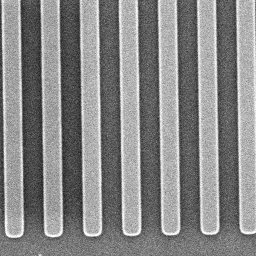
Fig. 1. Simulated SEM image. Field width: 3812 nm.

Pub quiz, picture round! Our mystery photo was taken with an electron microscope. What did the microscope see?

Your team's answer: groups of lines, slits or small figures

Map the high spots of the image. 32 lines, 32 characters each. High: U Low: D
UUDDDUUDDDUUDDDUUDDDUUDDDUUDDDUU
UUDDDUUDDDUUDDDUUDDDUUDDDUUDDDUU
UUUDDUUDDDUUDDDUUDDDUUDDDUUDDDUU
UUUDDUUDDDUUDDDUUDDDUUDDDUUDDDUU
UUUDDUUDDDUUDDDUUDDDUUDDDUUDDDUU
UUUDDUUDDDUUDDDUUDDDUUDDDUUDDDUU
UUUDDUUUDDUUDDDUUDDDUUDDDUUDDDUU
UUUDDUUUDDUUDDDUUDDDUUDDDUUDDDUU
UUUDDUUUDDUUDDDUUDDDUUDDDUUDDDUU
UUUDDUUUDDUUDDDUUDDDUUDDDUUDDDUU
UUUDDUUUDDUUDDDUUDDDUUDDDUUDDDUU
UUUDDUUUDDUUDDDUUDDDUUDDDUUDDDUU
UUUDDUUUDDUUDDDUUDDDUUDDDUUDDDUU
UUUDDUUUDDUUDDDUUDDDUUDDDUUDDDUU
UUUDDUUUDDUUDDDUUDDDUUDDDUUDDDUU
DUUDDUUUDDUUDDDUUDDDUUDDDUUDDDUU
DUUDDUUUDDUUDDDUUDDDUUDDDUUDDDUU
DUUDDUUUDDUUDDDUUDDDUUDDDUUDDDUU
DUUDDUUUDDUUDDDUUDDDUUDDDUUDDDUU
DUUDDUUUDDUUUDDUUDDDUUDDDUUDDDUU
DUUDDDUUDDUUUDDUUDDDUUDDDUUDDDUU
DUUDDDUUDDUUUDDUUDDDUUDDDUUDDDUU
DUUDDDUUDDUUUDDUUDDDUUDDDUUDDDUU
DUUDDDUUDDUUUDDUUDDDUUDDDUUDDDUU
DUUDDDUUDDUUUDDUUUDDUUDDDUUDDDUU
DUUDDDUUDDUUUDDUUUDDUUDDDUUDDDUU
DUUDDDUUDDUUUDDUUUDDUUDDDUUDDDUU
DUUDDDUUDDUUUDDUUUDDUUDDDUUDDDUU
DUUDDDUUDDUUUDDUUUDDUUDDDUUDDDUU
DUDDDDUDDDDDDDDDDDDDDDDDDDDDDDDD
DDDDDDDDDDDDDDDDDDDDDDDDDDDDDDDD
DDDDDDDDDDDDDDDDDDDDDDDDDDDDDDDD